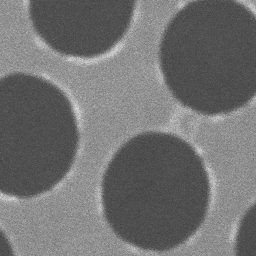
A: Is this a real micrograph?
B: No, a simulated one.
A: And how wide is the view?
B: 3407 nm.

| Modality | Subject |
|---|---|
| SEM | holes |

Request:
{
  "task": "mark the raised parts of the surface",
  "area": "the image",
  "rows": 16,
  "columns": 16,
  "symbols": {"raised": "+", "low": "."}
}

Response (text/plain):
++......+++.....
++......++......
+++.....++......
++++..++++......
++++++++++......
....++++++......
.....++++++....+
.....++++++..+++
.....+++....++++
.....++.....++++
....+++......+++
....++.......+++
++++++.......+++
+++++++......++.
+++++++.....++..
.+++++++...++++.